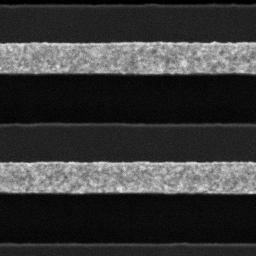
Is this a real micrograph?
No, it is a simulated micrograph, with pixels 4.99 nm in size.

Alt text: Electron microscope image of lines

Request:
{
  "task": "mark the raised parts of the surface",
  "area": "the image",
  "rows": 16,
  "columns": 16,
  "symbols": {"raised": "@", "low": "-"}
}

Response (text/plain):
@@@@@@@@@@@@@@@@
@@@@@@@@@@@@@@@@
@@@@@@@@@@@@@@@@
@@@@@@@@@@@@@@@@
@@@@@@@@@@@@@@@@
----------------
----------------
----------------
@@@@@@@@@@@@@@@@
@@@@@@@@@@@@@@@@
@@@@@@@@@@@@@@@@
@@@@@@@@@@@@@@@@
----------------
----------------
----------------
@@@@@@@@@@@@@@@@